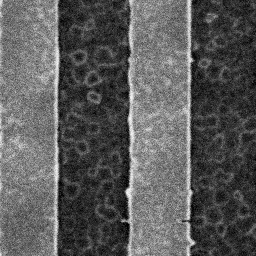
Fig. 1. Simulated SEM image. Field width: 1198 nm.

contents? one or a few lines or trenches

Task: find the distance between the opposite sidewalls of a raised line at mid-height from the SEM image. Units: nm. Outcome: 275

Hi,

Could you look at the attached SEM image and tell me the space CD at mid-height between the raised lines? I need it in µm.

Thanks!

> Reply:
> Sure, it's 0.342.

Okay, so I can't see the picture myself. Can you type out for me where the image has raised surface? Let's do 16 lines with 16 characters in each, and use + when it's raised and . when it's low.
++++....++++....
++++....++++....
++++....++++....
++++....++++....
++++....++++....
++++....++++....
++++....++++....
++++....++++....
++++....++++....
++++....++++....
++++....++++....
++++....++++....
++++....++++....
++++....++++....
++++....++++....
++++....++++....